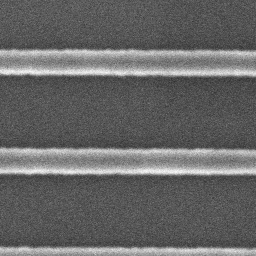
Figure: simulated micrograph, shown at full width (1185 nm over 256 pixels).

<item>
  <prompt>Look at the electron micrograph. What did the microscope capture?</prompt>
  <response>lines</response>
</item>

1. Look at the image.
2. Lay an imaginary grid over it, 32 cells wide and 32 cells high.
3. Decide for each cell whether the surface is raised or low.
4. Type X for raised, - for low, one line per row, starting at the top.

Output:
--------------------------------
--------------------------------
--------------------------------
--------------------------------
--------------------------------
--------------------------------
XXXXXXXXXXXXXXXXXXXXXXXXXXXXXX--
XXXXXXXXXXXXXXXXXXXXXXXXXXXXXXXX
XXXXXXXXXXXXXXXXXXXXXXXXXXXXXXXX
--------------------------------
--------------------------------
--------------------------------
--------------------------------
--------------------------------
--------------------------------
--------------------------------
--------------------------------
--------------------------------
--------------------------------
XXXXXXXXXXXXXXXXXXXXXXXXXXXXXXXX
XXXXXXXXXXXXXXXXXXXXXXXXXXXXXXXX
XXXXXXXXXXXXXXXXXXXXXXXXXXXXXXXX
--------------------------------
--------------------------------
--------------------------------
--------------------------------
--------------------------------
--------------------------------
--------------------------------
--------------------------------
--------------------------------
XXXXXXXXXXXXXXXXXXXXXXXXXXXXXXXX